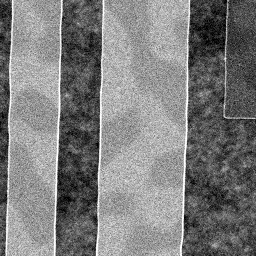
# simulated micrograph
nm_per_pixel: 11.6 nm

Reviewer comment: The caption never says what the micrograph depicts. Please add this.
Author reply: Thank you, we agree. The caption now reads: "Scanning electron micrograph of groups of lines, slits or small figures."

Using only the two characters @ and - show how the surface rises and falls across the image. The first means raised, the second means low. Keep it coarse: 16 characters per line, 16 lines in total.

-@@@--@@@@@@--@@
-@@@--@@@@@@--@@
-@@@--@@@@@@--@@
-@@@--@@@@@@--@@
-@@@--@@@@@@--@@
-@@@--@@@@@@--@@
-@@@--@@@@@@--@@
-@@@--@@@@@@----
-@@@--@@@@@@----
-@@@--@@@@@@----
-@@@--@@@@@@----
-@@@--@@@@@@----
@@@---@@@@@-----
@@@---@@@@@-----
@@@---@@@@@-----
@@@---@@@@@-----